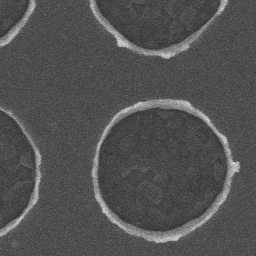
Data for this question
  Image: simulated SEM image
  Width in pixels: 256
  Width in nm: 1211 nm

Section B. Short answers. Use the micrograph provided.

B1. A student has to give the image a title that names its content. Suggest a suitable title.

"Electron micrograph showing holes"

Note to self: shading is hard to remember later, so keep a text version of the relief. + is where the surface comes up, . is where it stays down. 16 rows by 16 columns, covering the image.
..++++........++
.++++++......+++
++++++++....++++
++++++++++++++++
++++++++++++++++
++++++++++++++++
++++++++++++++++
.++++++......+++
..+++++.......++
..++++........++
..++++........++
..++++........++
..++++........++
.++++++......+++
+++++++++..+++++
++++++++++++++++